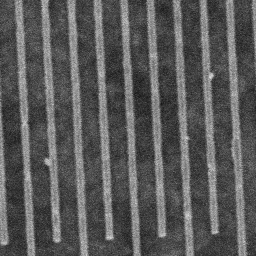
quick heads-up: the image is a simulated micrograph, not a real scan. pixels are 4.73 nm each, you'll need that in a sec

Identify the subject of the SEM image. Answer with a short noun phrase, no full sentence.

parallel lines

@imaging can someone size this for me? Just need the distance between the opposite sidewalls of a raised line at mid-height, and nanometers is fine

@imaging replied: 28.3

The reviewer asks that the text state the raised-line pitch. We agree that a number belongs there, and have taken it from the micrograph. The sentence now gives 124 nm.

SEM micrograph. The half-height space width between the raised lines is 96.2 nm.